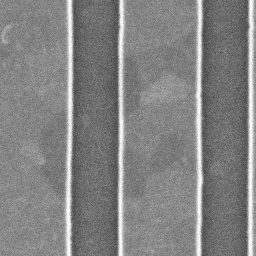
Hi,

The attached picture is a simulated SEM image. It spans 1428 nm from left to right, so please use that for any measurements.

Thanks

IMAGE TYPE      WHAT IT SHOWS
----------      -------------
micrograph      one or a few lines or trenches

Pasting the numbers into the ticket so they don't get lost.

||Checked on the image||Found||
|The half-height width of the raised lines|441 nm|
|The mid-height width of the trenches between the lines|284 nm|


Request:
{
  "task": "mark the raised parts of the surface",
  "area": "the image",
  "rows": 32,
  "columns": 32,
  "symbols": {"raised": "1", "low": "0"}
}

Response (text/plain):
11111111100000011111111110000001
11111111100000011111111110000001
11111111100000011111111110000001
11111111100000011111111110000001
11111111100000011111111110000001
11111111100000011111111110000001
11111111100000011111111110000001
11111111100000011111111110000001
11111111100000011111111110000001
11111111100000011111111110000001
11111111100000011111111110000001
11111111100000011111111110000001
11111111100000011111111110000001
11111111100000011111111110000001
11111111100000011111111110000001
11111111100000011111111110000001
11111111100000011111111110000001
11111111100000011111111110000001
11111111100000011111111110000001
11111111100000011111111110000001
11111111100000011111111110000001
11111111100000011111111110000001
11111111100000011111111110000001
11111111100000011111111110000001
11111111100000011111111110000001
11111111100000011111111110000001
11111111100000011111111110000001
11111111100000011111111110000001
11111111100000011111111110000001
11111111100000011111111110000001
11111111100000011111111110000001
11111111100000011111111110000001